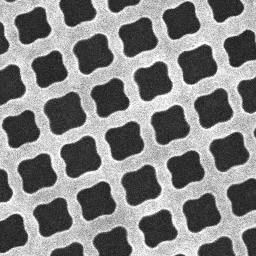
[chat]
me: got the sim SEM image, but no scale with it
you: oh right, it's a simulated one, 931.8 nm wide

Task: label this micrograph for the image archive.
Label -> a regular array of holes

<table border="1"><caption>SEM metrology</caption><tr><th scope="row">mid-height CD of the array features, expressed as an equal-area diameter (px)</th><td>36.8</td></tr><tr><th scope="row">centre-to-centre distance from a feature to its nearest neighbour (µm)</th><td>0.169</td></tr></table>